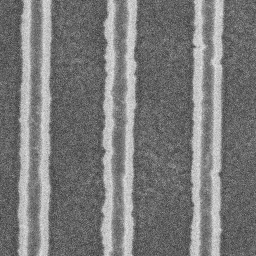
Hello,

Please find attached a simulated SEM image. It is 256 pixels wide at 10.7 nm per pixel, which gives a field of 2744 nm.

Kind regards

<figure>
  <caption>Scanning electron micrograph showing one or a few lines or trenches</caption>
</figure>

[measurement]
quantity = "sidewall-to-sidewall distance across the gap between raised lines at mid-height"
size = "682 nm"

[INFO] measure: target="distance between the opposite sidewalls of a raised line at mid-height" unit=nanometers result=240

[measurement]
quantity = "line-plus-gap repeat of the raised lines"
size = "922 nm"